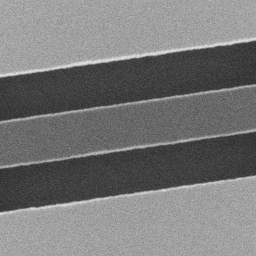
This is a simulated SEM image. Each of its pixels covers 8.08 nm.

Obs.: lines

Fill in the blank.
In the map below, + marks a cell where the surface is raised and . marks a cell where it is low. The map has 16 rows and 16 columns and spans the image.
++++++++++++++++
++++++++++++++++
++++++++++++++++
+++++++++.......
++..............
...............+
........++++++++
.+++++++++++++++
++++++++++++++..
+++++++.........
................
.............+++
......++++++++++
++++++++++++++++
++++++++++++++++
++++++++++++++++